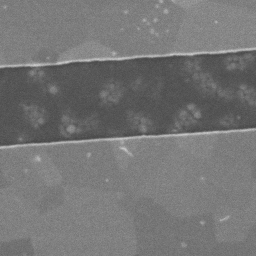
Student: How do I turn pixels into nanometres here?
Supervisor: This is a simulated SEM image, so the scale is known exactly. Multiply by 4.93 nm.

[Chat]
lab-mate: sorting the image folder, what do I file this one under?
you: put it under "one or a few lines or trenches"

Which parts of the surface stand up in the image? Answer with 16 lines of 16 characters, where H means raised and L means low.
HHHHHHHHHHHHHHHH
HHHHHHHHHHHHHHHH
HHHHHHHHHHHHHHHH
HHHHHHHHHHLLLLLL
LLLLLLLLLLLLLLLL
LLLLLLLLLLLLLLLL
LLLLLLLLLLLLLLLL
LLLLLLLLLLLLLLLL
LLLLLLLLLLHHHHHH
HHHHHHHHHHHHHHHH
HHHHHHHHHHHHHHHH
HHHHHHHHHHHHHHHH
HHHHHHHHHHHHHHHH
HHHHHHHHHHHHHHHH
HHHHHHHHHHHHHHHH
HHHHHHHHHHHHHHHH